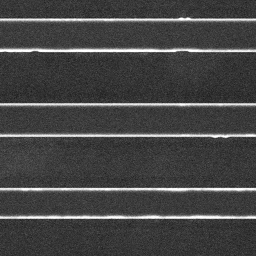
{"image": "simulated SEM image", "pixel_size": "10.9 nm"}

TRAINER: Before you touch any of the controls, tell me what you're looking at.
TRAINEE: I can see lines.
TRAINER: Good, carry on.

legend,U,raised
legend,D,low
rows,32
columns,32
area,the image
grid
DDDDDDDDDDDDDDDDDDDDDDDDDDDDDDDD
DDDDDDDDDDDDDDDDDDDDDDDDDDDDDDDD
UUUUUUUUUUUUUUUUUUUUUUUUUUUUUUUU
UUUUUUUUUUUUUUUUUUUUUUUUUUUUUUUU
UUUUUUUUUUUUUUUUUUUUUUUUUUUUUUUU
UUUUUUUUUUUUUUUUUUUUUUUUUUUUUUUU
DDDDDDDDDDDDDDDDDDDDDDDDDDDDDDDD
DDDDDDDDDDDDDDDDDDDDDDDDDDDDDDDD
DDDDDDDDDDDDDDDDDDDDDDDDDDDDDDDD
DDDDDDDDDDDDDDDDDDDDDDDDDDDDDDDD
DDDDDDDDDDDDDDDDDDDDDDDDDDDDDDDD
DDDDDDDDDDDDDDDDDDDDDDDDDDDDDDDD
DDDDDDDDDDDDDDDDDDDDDDDDDDDDDDDD
UUUUUUUUUUUUUUUUUUUUUUUUUUUUUUUU
UUUUUUUUUUUUUUUUUUUUUUUUUUUUUUUU
UUUUUUUUUUUUUUUUUUUUUUUUUUUUUUUU
UUUUUUUUUUUUUUUUUUUUUUUUUUUUUUUU
DDDDDDDDDDDDDDDDDDDDDDDDDDDDDDDD
DDDDDDDDDDDDDDDDDDDDDDDDDDDDDDDD
DDDDDDDDDDDDDDDDDDDDDDDDDDDDDDDD
DDDDDDDDDDDDDDDDDDDDDDDDDDDDDDDD
DDDDDDDDDDDDDDDDDDDDDDDDDDDDDDDD
DDDDDDDDDDDDDDDDDDDDDDDDDDDDDDDD
DDDDDDDDDDDDDDDDDDDDDDDDDDDDDDDD
UUUUUUUUUUUUUUUUUUUUUUUUUUUUUUUU
UUUUUUUUUUUUUUUUUUUUUUUUUUUUUUUU
UUUUUUUUUUUUUUUUUUUUUUUUUUUUUUUU
DDDDDDDDDDDDDDDDDDDDDDDDDDDDDDDD
DDDDDDDDDDDDDDDDDDDDDDDDDDDDDDDD
DDDDDDDDDDDDDDDDDDDDDDDDDDDDDDDD
DDDDDDDDDDDDDDDDDDDDDDDDDDDDDDDD
DDDDDDDDDDDDDDDDDDDDDDDDDDDDDDDD